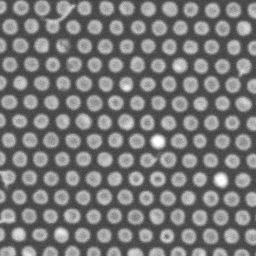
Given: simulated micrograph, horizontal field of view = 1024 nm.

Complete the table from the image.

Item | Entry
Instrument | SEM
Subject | a regular array of raised bodies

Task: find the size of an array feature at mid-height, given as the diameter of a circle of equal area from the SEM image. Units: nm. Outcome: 53.2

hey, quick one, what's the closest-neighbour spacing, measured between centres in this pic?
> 83.8 nm